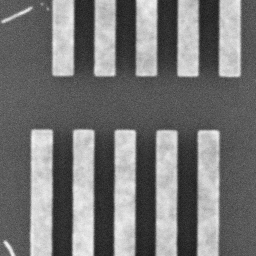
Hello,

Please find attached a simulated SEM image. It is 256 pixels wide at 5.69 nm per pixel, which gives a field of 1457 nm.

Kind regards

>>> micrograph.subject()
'groups of lines, slits or small figures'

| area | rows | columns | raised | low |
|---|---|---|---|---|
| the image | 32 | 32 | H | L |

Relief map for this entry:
LLLLLLLHHLLLHHLLLHHHLLHHHLLLHHLL
LLLLLLLHHLLLHHLLLHHHLLHHHLLLHHLL
LLLLLLLHHLLLHHLLLHHHLLHHHLLLHHLL
LLLLLLLHHLLLHHLLLHHHLLHHHLLLHHLL
LLLLLLLHHLLLHHLLLHHHLLHHHLLLHHLL
LLLLLLLHHLLLHHLLLHHHLLHHHLLHHHLL
LLLLLLLHHLLLHHLLLHHHLLHHHLLHHHLL
LLLLLLLHHLLLHHLLLHHHLLHHHLLHHHLL
LLLLLLLHHLLLHHLLLHHHLLHHHLLHHHLL
LLLLLLLLLLLLLLLLLLLLLLLLLLLLHHLL
LLLLLLLLLLLLLLLLLLLLLLLLLLLLLLLL
LLLLLLLLLLLLLLLLLLLLLLLLLLLLLLLL
LLLLLLLLLLLLLLLLLLLLLLLLLLLLLLLL
LLLLLLLLLLLLLLLLLLLLLLLLLLLLLLLL
LLLLLLLLLLLLLLLLLLLLLLLLLLLLLLLL
LLLLLLLLLLLLLLLLLLLLLLLLLLLLLLLL
LLLLHHLLLHHHLLLHHLLLHHLLLHHLLLLL
LLLLHHLLLHHHLLHHHLLLHHLLLHHLLLLL
LLLLHHLLLHHHLLHHHLLLHHLLLHHLLLLL
LLLLHHLLLHHHLLHHHLLLHHLLLHHLLLLL
LLLLHHLLLHHHLLHHHLLLHHLLLHHLLLLL
LLLLHHLLLHHHLLHHHLLLHHLLLHHLLLLL
LLLLHHLLLHHHLLHHHLLLHHLLLHHLLLLL
LLLLHHLLLHHHLLHHHLLLHHLLLHHLLLLL
LLLLHHLLLHHHLLHHHLLLHHLLLHHLLLLL
LLLLHHLLLHHHLLHHHLLLHHLLLHHLLLLL
LLLLHHLLLHHHLLHHHLLLHHLLLHHLLLLL
LLLLHHLLLHHHLLHHHLLLHHLLLHHLLLLL
LLLLHHLLLHHHLLHHHLLLHHLLLHHLLLLL
LLLLHHLLLHHHLLHHHLLLHHLLLHHLLLLL
LLLLHHLLLHHHLLHHHLLLHHLLLHHLLLLL
LLLLHHLLLHHHLLHHHLLLHHLLLHHLLLLL